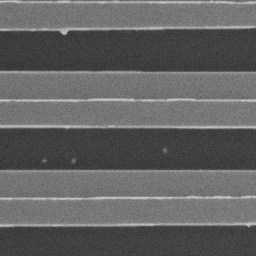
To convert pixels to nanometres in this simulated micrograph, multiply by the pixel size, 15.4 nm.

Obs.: lines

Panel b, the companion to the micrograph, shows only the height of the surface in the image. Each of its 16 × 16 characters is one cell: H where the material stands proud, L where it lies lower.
HHHHHHHHHHHHHHHH
HHHHHHHHHHHHHHHH
LLLLLLLLLLLLLLLL
LLLLLLLLLLLLLLLL
HHLLLLLLLLLLLLLL
HHHHHHHHHHHHHHHH
HHHHHHHHHHHHHHHH
HHHHHHHHHHHHHHHH
LLLLLLLLLLLLLLLL
LLLLLLLLLLLLLLLL
LLLLLLLLLLLLLLLL
HHHHHHHHHHHHHHHH
HHHHHHHHHHHHHHHH
HHHHHHHHHHHHHHHH
LLLLLLLLLLLLLLLL
LLLLLLLLLLLLLLLL